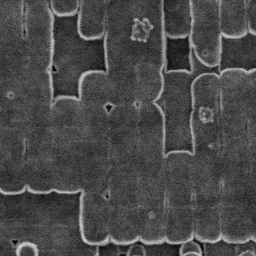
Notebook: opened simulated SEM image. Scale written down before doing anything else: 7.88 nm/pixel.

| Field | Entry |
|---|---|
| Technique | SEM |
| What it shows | wiring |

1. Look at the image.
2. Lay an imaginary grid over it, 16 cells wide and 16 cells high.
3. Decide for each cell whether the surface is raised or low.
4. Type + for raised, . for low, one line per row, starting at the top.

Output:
++++++++++..++++
+++..+++++..++++
+++...++++..++..
+++....+++..++..
+++...++++...+++
+++..+++++..++++
++++++++++..++++
++++++++++..++++
++++++++++..++++
++++++++++++++++
++++++++++++++++
++++++++++++++++
.....+++++++++++
.....+++++++++++
.....+++++++++++
.+..............